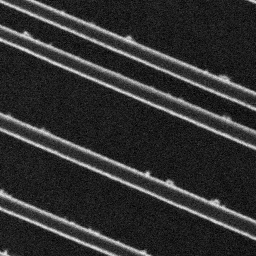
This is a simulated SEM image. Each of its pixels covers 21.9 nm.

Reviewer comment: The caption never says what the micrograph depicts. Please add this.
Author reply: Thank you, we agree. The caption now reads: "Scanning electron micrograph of lines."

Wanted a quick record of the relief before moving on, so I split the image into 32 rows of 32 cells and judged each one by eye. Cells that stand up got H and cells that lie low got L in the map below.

LHHHHLLLLLLLLLLLLLLLLLLLLLLLLLLL
LLLHHHHLLLLLLLLLLLLLLLLLLLLLLLLL
LLLLLHHHHHLLLLLLLLLLLLLLLLLLLLLL
HLLLLLLLHHHHLLLLLLLLLLLLLLLLLLLL
HHHLLLLLLLHHHHHLLLLLLLLLLLLLLLLL
LHHHHHLLLLLLHHHHHLLLLLLLLLLLLLLL
LLLHHHHHLLLLLLLHHHHLLLLLLLLLLLLL
LLLLLLHHHHLLLLLLLHHHHHLLLLLLLLLL
LLLLLLLLHHHHHLLLLLLHHHHHLLLLLLLL
LLLLLLLLLLHHHHHLLLLLLLHHHHHLLLLL
LLLLLLLLLLLLLHHHHHLLLLLLHHHHHLLL
LLLLLLLLLLLLLLLHHHHHLLLLLLLHHHHH
LLLLLLLLLLLLLLLLLHHHHHLLLLLLLHHH
LLLLLLLLLLLLLLLLLLLLHHHHHLLLLLLH
HLLLLLLLLLLLLLLLLLLLLLHHHHHLLLLL
HHHLLLLLLLLLLLLLLLLLLLLLLHHHHHLL
LHHHHLLLLLLLLLLLLLLLLLLLLLLHHHHH
LLLHHHHHLLLLLLLLLLLLLLLLLLLLLHHH
LLLLLHHHHHLLLLLLLLLLLLLLLLLLLLLL
LLLLLLLLHHHHHLLLLLLLLLLLLLLLLLLL
LLLLLLLLLLHHHHHLLLLLLLLLLLLLLLLL
LLLLLLLLLLLLHHHHHLLLLLLLLLLLLLLL
LLLLLLLLLLLLLLLHHHHHLLLLLLLLLLLL
LLLLLLLLLLLLLLLLLHHHHHLLLLLLLLLL
HLLLLLLLLLLLLLLLLLLHHHHHLLLLLLLL
HHHLLLLLLLLLLLLLLLLLLLHHHHHLLLLL
LHHHHHLLLLLLLLLLLLLLLLLLHHHHHLLL
LLLHHHHHLLLLLLLLLLLLLLLLLLHHHHHH
LLLLLLHHHHLLLLLLLLLLLLLLLLLLLHHH
LLLLLLLLHHHHHLLLLLLLLLLLLLLLLLLH
LLLLLLLLLLHHHHHLLLLLLLLLLLLLLLLL
LLLLLLLLLLLLLHHHHHLLLLLLLLLLLLLL